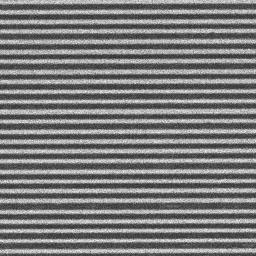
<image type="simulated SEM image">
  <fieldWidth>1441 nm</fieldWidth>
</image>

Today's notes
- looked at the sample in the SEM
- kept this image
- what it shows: parallel lines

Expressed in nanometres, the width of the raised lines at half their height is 23.9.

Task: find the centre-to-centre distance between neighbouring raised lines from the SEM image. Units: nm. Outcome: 56.1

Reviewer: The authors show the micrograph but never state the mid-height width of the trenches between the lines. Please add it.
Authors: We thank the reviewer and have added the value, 6 pixels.